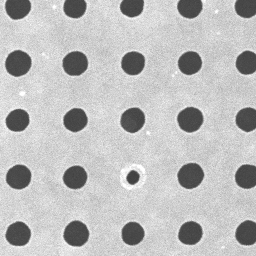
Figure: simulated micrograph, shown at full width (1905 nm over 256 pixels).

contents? a regular array of holes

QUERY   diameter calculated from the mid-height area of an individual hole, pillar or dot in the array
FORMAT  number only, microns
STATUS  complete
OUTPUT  0.189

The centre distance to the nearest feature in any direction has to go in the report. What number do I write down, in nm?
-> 421